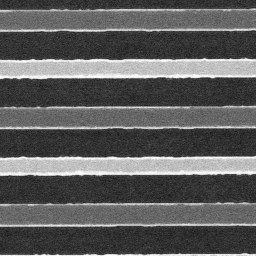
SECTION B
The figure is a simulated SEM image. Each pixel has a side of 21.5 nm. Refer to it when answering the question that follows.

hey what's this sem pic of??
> lines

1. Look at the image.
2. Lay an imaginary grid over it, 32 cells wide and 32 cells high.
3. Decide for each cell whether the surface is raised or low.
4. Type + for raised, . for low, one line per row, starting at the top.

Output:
................................
++++++++++++++++++++++++++++++++
++++++++++++++++++++++++++++++++
++++++++++++++++++++++++++++++++
................................
................................
................................
......+.....++...++.++++++++++++
++++++++++++++++++++++++++++++++
++++++++++++++.+++++++++++++++++
................................
................................
................................
.......+...+++++++++++++++++++++
++++++++++++++++++++++++++++++++
++++++++++++++++++++++++++++++++
................................
................................
................................
................................
++++++++++++++++++++++++++++++++
++++++++++++++++++++++++++++++++
................................
................................
................................
..........+..++.++++++++++++++++
++++++++++++++++++++++++++++++++
++++++++++++++++++++++++++++++++
................................
................................
................................
................................